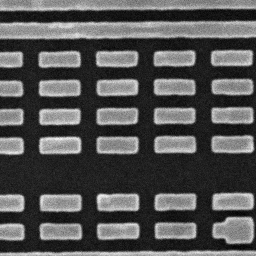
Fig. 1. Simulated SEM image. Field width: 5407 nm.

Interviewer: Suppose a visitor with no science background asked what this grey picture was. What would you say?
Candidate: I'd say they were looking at wiring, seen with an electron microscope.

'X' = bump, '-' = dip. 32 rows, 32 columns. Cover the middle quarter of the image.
XXXX--------XXXXX---------------
--------------------------------
--------------------------------
--------------------------------
XXXX-----XXXXXXXXX-----XXXXXXXXX
XXXX----XXXXXXXXXX-----XXXXXXXXX
XXXX----XXXXXXXXXX-----XXXXXXXXX
XXXX-----XXXXXXXXX-----XXXX-XXXX
--------------------------------
--------------------------------
--------------------------------
X-XX-----XXXXXXXXX-----XXXXXXXXX
XXXX----XXXXXXXXXX-----XXXXXXXXX
XXXX----XXXXXXXXXX-----XXXXXXXXX
XXXX----XXXXXXXXXX-----XXXXXXXXX
--------------------------------
--------------------------------
--------------------------------
XXX------XXXXXXXXX-----XXXXXXXXX
XXXX----XXXXXXXXXX-----XXXXXXXXX
XXXX----XXXXXXXXXX-----XXXXXXXXX
XXXX----XXXXXXXXXX-----XXXXXXXXX
--------------------------------
--------------------------------
--------------------------------
--------------------------------
--------------------------------
--------------------------------
--------------------------------
--------------------------------
--------------------------------
--------------------------------